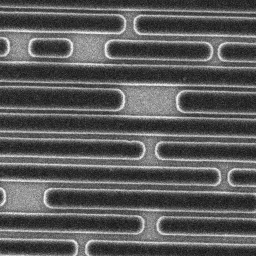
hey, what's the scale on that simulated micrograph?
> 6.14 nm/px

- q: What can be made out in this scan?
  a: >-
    parallel lines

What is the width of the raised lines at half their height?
120 nanometers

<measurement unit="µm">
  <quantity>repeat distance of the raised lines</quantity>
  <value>0.154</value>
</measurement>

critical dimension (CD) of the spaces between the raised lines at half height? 35.3 nm